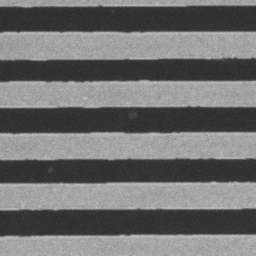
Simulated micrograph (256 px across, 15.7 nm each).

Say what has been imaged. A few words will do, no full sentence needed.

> lines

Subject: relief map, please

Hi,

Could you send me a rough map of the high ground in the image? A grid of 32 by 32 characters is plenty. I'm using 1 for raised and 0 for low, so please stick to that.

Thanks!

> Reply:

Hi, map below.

11111111111111111111111111111111
00000000000000000000000000000000
00000000000000000000000000000000
00000000000000000000000000000000
11111111111111111111111111111111
11111111111111111111111111111111
11111111111111111111111111111111
00000000000000000000000000000000
00000000000000000000000000000000
00000000000000000000000000000000
10000000001111111111111111111111
11111111111111111111111111111111
11111111111111111111111111111111
00000000000000000000000000000000
00000000000000000000000000000000
00000000000000000000000000000000
00000000000000000000000000000000
11111111111111111111111111111111
11111111111111111111111111111111
11111111111111111111111111111111
00000000000000000000000000000000
00000000000000000000000000000000
00000000000000000000000000000000
11111111111111111111111111111111
11111111111111111111111111111111
11111111111111111111111111111111
00000000000000000000000000000000
00000000000000000000000000000000
00000000000000000000000000000000
00000000000000000000000000000011
11111111111111111111111111111111
11111111111111111111111111111111